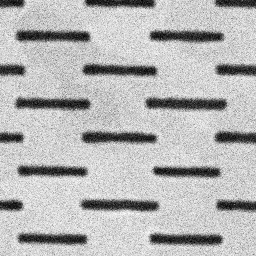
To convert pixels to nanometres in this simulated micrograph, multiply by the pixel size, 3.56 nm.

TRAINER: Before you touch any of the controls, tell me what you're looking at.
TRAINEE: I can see a regular array of holes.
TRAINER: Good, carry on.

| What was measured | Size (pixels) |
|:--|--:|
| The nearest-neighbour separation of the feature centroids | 67.2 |